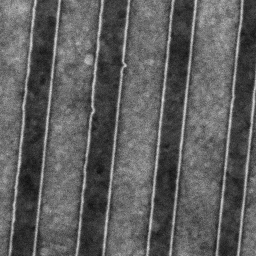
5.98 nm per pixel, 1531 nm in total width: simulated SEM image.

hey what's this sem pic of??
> one or a few lines or trenches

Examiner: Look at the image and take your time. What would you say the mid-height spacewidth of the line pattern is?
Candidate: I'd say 255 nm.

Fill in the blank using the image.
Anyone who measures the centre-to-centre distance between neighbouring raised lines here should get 408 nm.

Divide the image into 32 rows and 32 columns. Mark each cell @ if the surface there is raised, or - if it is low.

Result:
----@@@------@@@------@@------@@
----@@@------@@@-----@@@------@@
----@@@-----@@@@-----@@@------@@
----@@@-----@@@@-----@@@------@@
----@@@-----@@@@-----@@@------@@
----@@@-----@@@@-----@@@------@@
----@@@-----@@@@-----@@@------@@
----@@@-----@@@------@@@-----@@@
----@@@-----@@@@-----@@@-----@@@
---@@@@-----@@@------@@@-----@@@
---@@@------@@@------@@------@@@
---@@@------@@@-----@@@------@@@
---@@@------@@@-----@@@------@@@
---@@@------@@@-----@@@------@@@
---@@@-----@@@@-----@@@------@@@
---@@@-----@@@@-----@@@------@@-
---@@@-----@@@@-----@@@------@@-
---@@@-----@@@------@@@-----@@@-
---@@@-----@@@------@@@-----@@@-
--@@@@-----@@@------@@@-----@@@-
--@@@------@@@------@@------@@@-
--@@@------@@@-----@@@------@@@-
--@@@------@@@-----@@@------@@@-
--@@@-----@@@@-----@@@------@@@-
--@@@-----@@@@-----@@@------@@@-
--@@@-----@@@@-----@@@------@@--
--@@@-----@@@------@@@------@@--
--@@@-----@@@------@@@-----@@@--
--@@@-----@@@------@@@-----@@@--
-@@@@-----@@@------@@@-----@@@--
-@@@------@@@------@@------@@@--
-@@@------@@@-----@@@------@@@--